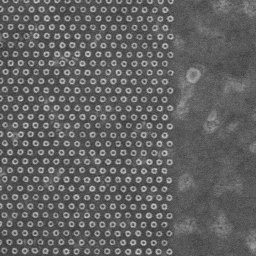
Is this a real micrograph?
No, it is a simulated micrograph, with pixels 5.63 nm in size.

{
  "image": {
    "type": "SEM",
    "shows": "a regular array of raised bodies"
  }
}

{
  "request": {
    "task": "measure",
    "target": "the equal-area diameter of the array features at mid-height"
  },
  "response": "0.0262 microns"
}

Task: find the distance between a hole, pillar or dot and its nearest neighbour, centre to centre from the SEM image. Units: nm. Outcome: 55.7